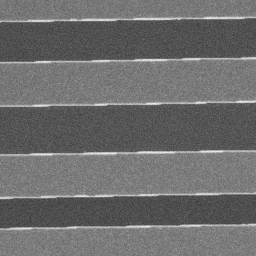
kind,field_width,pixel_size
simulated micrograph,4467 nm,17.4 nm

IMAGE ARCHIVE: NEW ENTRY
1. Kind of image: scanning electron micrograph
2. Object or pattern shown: lines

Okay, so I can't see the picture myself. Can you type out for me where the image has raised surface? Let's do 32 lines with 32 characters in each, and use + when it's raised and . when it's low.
++++++++++++++++++++++++++++++++
++++++++++++++++++++++++++++++++
+++++++++++++++.................
................................
................................
................................
................................
.................+++++++++++++++
++++++++++++++++++++++++++++++++
++++++++++++++++++++++++++++++++
++++++++++++++++++++++++++++++++
++++++++++++++++++++++++++++++++
++++++++++++++++++++++++++++++++
................................
................................
................................
................................
................................
................................
++++++++++++++++++++++++++++++++
++++++++++++++++++++++++++++++++
++++++++++++++++++++++++++++++++
++++++++++++++++++++++++++++++++
++++++++++++++++++++++++++++++++
++++++++++++++..................
................................
................................
................................
........++++++++++++++++++++++++
++++++++++++++++++++++++++++++++
++++++++++++++++++++++++++++++++
++++++++++++++++++++++++++++++++